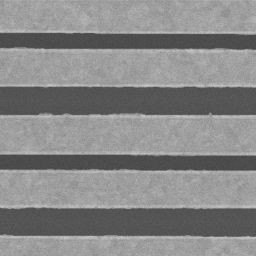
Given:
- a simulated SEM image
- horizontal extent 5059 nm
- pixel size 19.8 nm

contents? lines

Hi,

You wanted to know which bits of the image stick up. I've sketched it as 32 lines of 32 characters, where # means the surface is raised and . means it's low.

################################
################################
################################
################################
................................
................................
################################
################################
################################
################################
################################
................................
................................
................................
################################
################################
################################
################################
################################
................................
................................
################################
################################
################################
################################
################################
................................
................................
................................
................................
################################
################################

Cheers